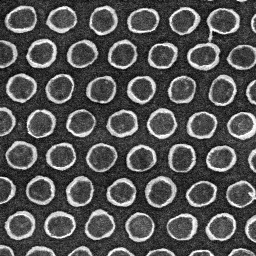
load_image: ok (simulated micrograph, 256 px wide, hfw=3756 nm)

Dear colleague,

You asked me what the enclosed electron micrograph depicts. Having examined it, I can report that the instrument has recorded a regular array of raised bodies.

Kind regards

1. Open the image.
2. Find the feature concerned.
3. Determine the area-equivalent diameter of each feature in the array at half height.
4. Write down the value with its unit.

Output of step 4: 396 nm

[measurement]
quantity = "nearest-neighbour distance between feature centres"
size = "571 nm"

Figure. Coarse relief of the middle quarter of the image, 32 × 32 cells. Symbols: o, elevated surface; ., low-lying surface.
..ooo........ooo......ooooo.....
................................
................................
oo................ooo........oo.
oo.....oooooo....ooooo.....ooooo
oo.....oooooo...ooooooo....ooooo
oo....ooooooo...ooooooo....ooooo
oo....ooooooo...oooooo....oooooo
o.....oooooo.....ooooo.....ooooo
........ooo.................ooo.
................................
................................
..ooooo......oooo......oooo.....
.ooooooo...ooooooo....ooooo.....
.ooooooo...ooooooo...ooooooo...o
.oooooo....ooooooo...ooooooo...o
.oooooo.....oooooo...oooooo.....
..ooo........oo.......oooo......
................................
................................
oo......oooo......o.........ooo.
oo.....oooooo....ooooo.....ooooo
ooo...ooooooo...oooooo.....ooooo
ooo...ooooooo...ooooooo....ooooo
ooo...oooooo....ooooooo....ooooo
oo.....ooooo....oooooo.....ooooo
........ooo.......oo.......oooo.
................................
................................
..ooooo......ooo......ooooo.....
.oooooo.....ooooo....oooooo.....
.oooooo....ooooooo...oooooo....o